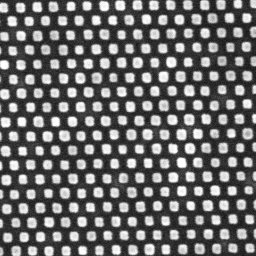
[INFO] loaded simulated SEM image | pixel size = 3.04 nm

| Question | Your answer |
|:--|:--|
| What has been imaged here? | a regular array of raised bodies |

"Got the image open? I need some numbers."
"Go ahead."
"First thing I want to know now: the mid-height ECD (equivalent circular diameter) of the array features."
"27 nm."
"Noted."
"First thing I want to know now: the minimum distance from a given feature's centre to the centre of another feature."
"0.0489 um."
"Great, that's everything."